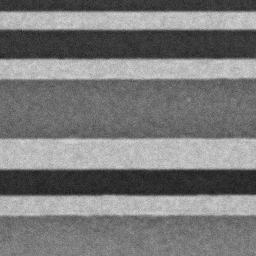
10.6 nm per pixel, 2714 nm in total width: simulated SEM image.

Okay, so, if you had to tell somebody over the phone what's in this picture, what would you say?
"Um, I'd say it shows lines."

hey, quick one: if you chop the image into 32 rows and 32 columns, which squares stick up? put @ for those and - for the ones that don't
--------------------------------
--------------------------------
@@@@@@@@@@@@@@@@@@@@@@@@@@@@@@@@
@@@@@@@@@@@@@@@@@@@@@@@@@@@@@@@@
--------------------------------
--------------------------------
--------------------------------
@@@@@@@@@@@@@@@@@@@@@@@@@@@@@@@@
@@@@@@@@@@@@@@@@@@@@@@@@@@@@@@@@
@@@@@@@@@@@@@@@@@@@@@@@@@@@@@@@@
--------------------------------
--------------------------------
--------------------------------
--------------------------------
--------------------------------
--------------------------------
--------------------------------
-------@@@-@@------@@@@@@@-@@@@@
@@@@@@@@@@@@@@@@@@@@@@@@@@@@@@@@
@@@@@@@@@@@@@@@@@@@@@@@@@@@@@@@@
@@@@@@@@@@@@@@@@@@@@@@@@@@@@@@@@
--------------------------------
--------------------------------
--------------------------------
----------@--@@@--------@@@@@@@@
@@@@@@@@@@@@@@@@@@@@@@@@@@@@@@@@
@@@@@@@@@@@@@@@@@@@@@@@@@@@@@@@@
--------------------------------
--------------------------------
--------------------------------
--------------------------------
--------------------------------